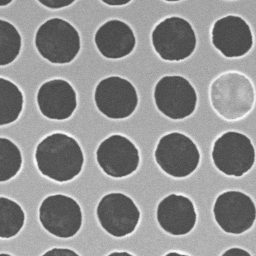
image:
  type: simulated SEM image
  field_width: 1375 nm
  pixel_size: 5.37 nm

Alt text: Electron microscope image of a regular array of holes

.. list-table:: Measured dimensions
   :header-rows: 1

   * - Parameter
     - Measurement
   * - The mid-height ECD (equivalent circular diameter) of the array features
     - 228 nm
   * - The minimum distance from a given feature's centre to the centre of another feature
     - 311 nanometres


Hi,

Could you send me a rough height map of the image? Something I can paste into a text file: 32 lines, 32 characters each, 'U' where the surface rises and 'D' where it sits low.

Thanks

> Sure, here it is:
DUUUUDDDDUUUUDDDUUUUUUUUUUUUUUUU
UUUUUUUUUUUUUUUUUUUUUUUUUUUUUUUU
UUUUUUDDUUUUUUDUUUUUUDDUUUUDDDUU
DDUUUDDDDUUUDDDDUUUDDDDDUUUDDDDU
DDDUUDDDDDUUDDDDDUUDDDDDUUUDDDDU
DDDUDDDDDDUUDDDDDUUDDDDDUUUDDDDU
DDUUUDDDDDUUUDDDUUUUDDDDUUUUDDDU
DDUUUUDDDUUUUUUUUUUUUDUUUUUUUUUU
UUUUUUUUUUUUUUUUUUUUUUUUUUUUUUUU
UUUUUUUUUUUUUUUUUUUUUDUUUUUUUUUU
DDUUUDDDDUUUDDDDUUUUDDDDUUUUUUUU
DDDUUDDDDUUUDDDDDUUDDDDDUUUUUUUU
DDDUUDDDDUUUDDDDDUUDDDDDDUUUUUUU
DDDUUDDDDUUUDDDDDUUUDDDDUUUUUUUU
DDUUUUDDDUUUUDDDUUUUUDDUUUUUUUUU
DUUUUUUUUUUUUUUUUUUUUUUUUUUUUUUU
UUUUUUUUUUUUUUUUUUUUUUUUUUUUUUUU
DUUUUDDDDUUUUDDDUUUUDDDDUUUDDDDU
DDUUUDDDDDUUDDDDDUUUDDDDDUUDDDDD
DDDUDDDDDDUUDDDDDUUDDDDDDUUDDDDD
DDDUUDDDDDUUDDDDDUUUDDDDDUUDDDDD
DDUUUDDDDDUUUDDDDUUUUDDDUUUUDDDU
DUUUUUUDDUUUUUUUUUUUUUUUUUUUUUUU
UUUUUUUUUUUUUUUUUUUUUUUUUUUUUUUU
UUUUUUDDUUUUUDDDUUUUUDDUUUUDDDDU
DDUUUDDDDDUUDDDDDUUUDDDDUUUDDDDD
DDDUUDDDDDUUDDDDDUUUDDDDUUUDDDDD
DDDUUDDDDDUUDDDDDUUUDDDDUUUDDDDD
DDDUUUDDDDUUUDDDDUUUDDDDUUUUDDDU
DDUUUUUDDUUUUUDUUUUUUUUUUUUUUUUU
UUUUUUUUUUUUUUUUUUUUUUUUUUUUUUUU
UUUUUUDDDUUUUUUUUUUUUUUUUUUUDDDU